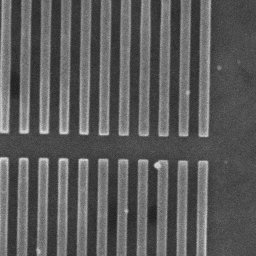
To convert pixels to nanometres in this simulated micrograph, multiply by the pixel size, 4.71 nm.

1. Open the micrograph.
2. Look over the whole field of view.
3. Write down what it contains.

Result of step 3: groups of lines, slits or small figures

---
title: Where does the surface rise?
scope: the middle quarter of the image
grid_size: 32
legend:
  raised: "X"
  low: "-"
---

X---XX---XX---XX---XX---XX---XX-
X---XX---XX---XX---XX---XX---XX-
X---XX---XX---XX---XX---XX---XX-
X---XX---XX---XX---XX---XX---XX-
X---XX---XX---XX---XX---XX---XX-
X---XX---XX---XX---XX---XX---XX-
X---XX---XX---XX---XX---XX---XX-
X---XX---XX---XX---XX---XX---XX-
X---XX---XX---XX---XX---XX---XX-
X---XX---XX---XX---XX---XX---XX-
X---XX---XX---XX---XX---XX---XX-
X---XX---XX---XX---XX---XX---XX-
X---XX---XX---XX---XX---XX---XX-
X---XX---XX---XX---XX---XX---XX-
X---XX---XX---XX---XX---XX---XX-
X---XX---XX---XX---XX---XX---XX-
X---XX---XX---XX---XX---XX---XX-
---------XX---XX---XX---XX---XX-
--------------------------------
--------------------------------
--------------------------------
--------------------------------
--------------------------------
--------------------------------
X---XX---XX---XX---XX--XXX---XX-
X---XX---XX---XX---XX--XXX---XX-
X---XX---XX---XX---XX---XX---XX-
X---XX---XX---XX---XX---XX---XX-
X---XX---XX---XX---XX---XX---XX-
X---XX---XX---XX---XX---XX---XX-
X---XX---XX---XX---XX---XX---XX-
X---XX---XX---XX---XX---XX---XX-